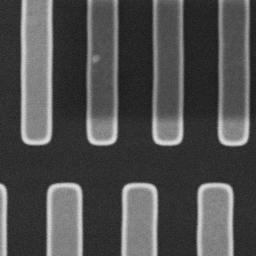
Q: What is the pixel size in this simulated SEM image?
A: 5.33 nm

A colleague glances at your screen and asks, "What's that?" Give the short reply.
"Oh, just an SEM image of groups of lines, slits or small figures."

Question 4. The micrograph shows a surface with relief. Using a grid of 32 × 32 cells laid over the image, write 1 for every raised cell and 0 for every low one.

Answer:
00011100000111100001111000001110
00011100000111100001111000001110
00011100000111100001111000001110
00011100000111100001111000001110
00011100000111100001111000001110
00011100000111100001111000001110
00011100000111100001111000001110
00011100000111100001111000001110
00011100000111000001111000001110
00011100000111000001111000001110
00011100000111000001111000001110
00011100000111000001111000001110
00011100000111000001111000001110
00011100000111000001111000011110
00011100000111000001111000011110
00011100000111000001111000011110
00011100000111000001111000011110
00011100000111000001110000001110
00000000000000000000000000000000
00000000000000000000000000000000
00000000000000000000000000000000
00000000000000000000000000000000
00000000000000000000000000000000
00000011110000001110000001111000
10000011110000011110000001111000
10000011110000011110000001111000
10000011110000011110000001111000
10000011110000011110000001111000
10000011110000011110000001111000
10000011110000011110000001111000
10000011110000011110000001111000
10000011110000011110000001111000